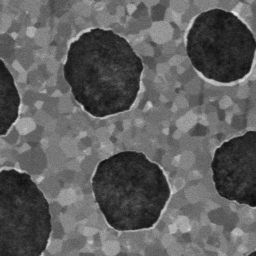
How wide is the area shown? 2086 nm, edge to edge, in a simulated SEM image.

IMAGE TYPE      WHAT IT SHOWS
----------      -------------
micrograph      holes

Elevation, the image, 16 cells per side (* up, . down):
****************
************...*
*****...****....
****.....***....
.***.....***....
.***.....*******
.****...********
.***************
***************.
********.****...
******....***...
..****.....**...
...***.....***..
...***....******
...*************
...*************